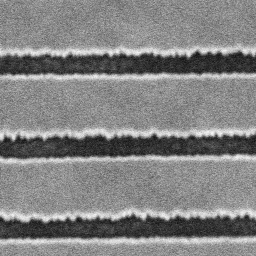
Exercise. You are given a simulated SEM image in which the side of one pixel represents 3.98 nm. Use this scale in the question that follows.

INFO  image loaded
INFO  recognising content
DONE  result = lines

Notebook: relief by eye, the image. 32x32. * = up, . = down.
********************************
********************************
********************************
********************************
********************************
********************************
********************************
................................
................................
********************************
********************************
********************************
********************************
********************************
********************************
********************************
********************************
................................
................................
................*.**.***********
********************************
********************************
********************************
********************************
********************************
********************************
********************************
..**.**.........................
................................
................................
********************************
********************************